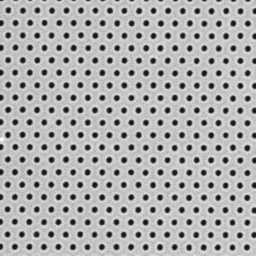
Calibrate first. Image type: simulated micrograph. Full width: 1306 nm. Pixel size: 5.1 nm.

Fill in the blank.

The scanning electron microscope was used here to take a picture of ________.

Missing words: a regular array of holes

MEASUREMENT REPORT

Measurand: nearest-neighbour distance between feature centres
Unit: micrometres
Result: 0.072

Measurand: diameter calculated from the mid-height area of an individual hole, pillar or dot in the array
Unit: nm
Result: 31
